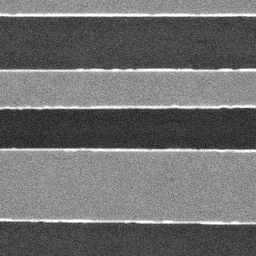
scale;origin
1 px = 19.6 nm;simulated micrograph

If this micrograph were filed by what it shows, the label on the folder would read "lines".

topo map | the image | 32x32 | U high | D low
UUUUUUUUUUUUUUUUUUUUUUUUUUUUUUUU
UUUUUUUUUUUUUUUUUUUUUUUUUUUUUUUU
DDDDDDDDDDDDDDDDDDDDDDDDDDDDDDDD
DDDDDDDDDDDDDDDDDDDDDDDDDDDDDDDD
DDDDDDDDDDDDDDDDDDDDDDDDDDDDDDDD
DDDDDDDDDDDDDDDDDDDDDDDDDDDDDDDD
DDDDDDDDDDDDDDDDDDDDDDDDDDDDDDDD
DDDDDDDDDDDDDDDDDDDDDDDDDDDDDDDD
DDDDDDDDDDDDDDDDDDDDDDDDDDDDDDDD
UUUUUUUUUUUUUUUUUUUUUUUUUUUUUUUU
UUUUUUUUUUUUUUUUUUUUUUUUUUUUUUUU
UUUUUUUUUUUUUUUUUUUUUUUUUUUUUUUU
UUUUUUUUUUUUUUUUUUUUUUUUUUUUUUUU
DDDDDDDDDDDDDDDDDDDDDDDDDDDDDDDD
DDDDDDDDDDDDDDDDDDDDDDDDDDDDDDDD
DDDDDDDDDDDDDDDDDDDDDDDDDDDDDDDD
DDDDDDDDDDDDDDDDDDDDDDDDDDDDDDDD
DDDDDDDDDDDDDDDDDDDDDDDDDDDDDDDD
DDDDDDDDDDDDDDDDDDDDDDDDDDDDDDDD
UUUUUUUUUUUUUUUUUUUUUUUUUUUUUUUU
UUUUUUUUUUUUUUUUUUUUUUUUUUUUUUUU
UUUUUUUUUUUUUUUUUUUUUUUUUUUUUUUU
UUUUUUUUUUUUUUUUUUUUUUUUUUUUUUUU
UUUUUUUUUUUUUUUUUUUUUUUUUUUUUUUU
UUUUUUUUUUUUUUUUUUUUUUUUUUUUUUUU
UUUUUUUUUUUUUUUUUUUUUUUUUUUUUUUU
UUUUUUUUUUUUUUUUUUUUUUUUUUUUUUUU
DUUUUUUUUUUUUUUUUUUUUUUUUUUUUUUU
DDDDDDDDDDDDDDDDDDDDDDDDDDDDDDDD
DDDDDDDDDDDDDDDDDDDDDDDDDDDDDDDD
DDDDDDDDDDDDDDDDDDDDDDDDDDDDDDDD
DDDDDDDDDDDDDDDDDDDDDDDDDDDDDDDD